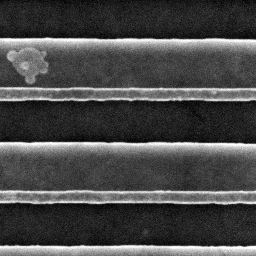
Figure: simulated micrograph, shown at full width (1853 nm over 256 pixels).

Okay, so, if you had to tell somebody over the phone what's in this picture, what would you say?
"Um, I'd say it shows lines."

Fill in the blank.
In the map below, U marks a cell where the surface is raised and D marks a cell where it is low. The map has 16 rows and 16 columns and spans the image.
DDDDDDDDDDDDDDDD
DDDDDDDDDDDDDDDD
UUUUUUUUUUUUUUUD
UUUUUUUUUUUUUUUU
UUUUUUUUUUUUUUUU
UUUUUUUUUUUUUUUU
DDDDDDDDDDDDDDDD
DDDDDDDDDDDDDDDD
DDDDDDDDDDDDDDDD
UUUUUUUUUUUUUUUU
UUUUUUUUUUUUUUUU
UUUUUUUUUUUUUUUU
UUUUUUUUUUUUUUUU
DDDDDDDDDDDDDDDD
DDDDDDDDDDDDDDDD
UUUUUUUUUUUUUUUU